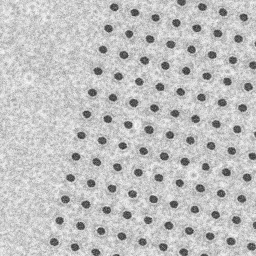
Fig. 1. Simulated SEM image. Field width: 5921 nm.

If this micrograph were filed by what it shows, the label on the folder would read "a regular array of holes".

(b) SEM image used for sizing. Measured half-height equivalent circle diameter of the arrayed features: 210 nm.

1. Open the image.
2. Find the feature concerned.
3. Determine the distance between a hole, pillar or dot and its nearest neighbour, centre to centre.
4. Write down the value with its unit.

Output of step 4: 492 nm